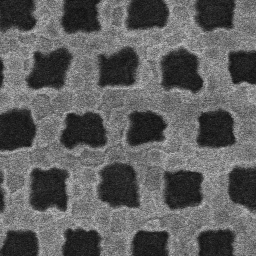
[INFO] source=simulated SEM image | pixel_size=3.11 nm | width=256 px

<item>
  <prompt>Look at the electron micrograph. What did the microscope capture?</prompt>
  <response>a regular array of holes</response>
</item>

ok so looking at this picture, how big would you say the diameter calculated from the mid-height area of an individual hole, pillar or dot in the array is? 121 nm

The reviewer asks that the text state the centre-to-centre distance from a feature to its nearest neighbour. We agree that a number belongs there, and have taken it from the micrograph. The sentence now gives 197 nm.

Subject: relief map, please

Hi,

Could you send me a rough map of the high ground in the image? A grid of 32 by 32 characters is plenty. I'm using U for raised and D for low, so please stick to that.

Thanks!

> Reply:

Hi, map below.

DDDDUUUUDDDDUUUUDDDDDUUUUDDDDUUU
DDDDUUUUDDDDUUUUDDDDDUUUUDDDDUUU
DDDDUUUUDDDDUUUUDDDDDUUUUDDDDUUU
DUDDUUUUDDDDUUUUDDUUUUUUUDDUUUUU
UUUUUUUUUUUUUUUUUUUUUUUUUUUUUUUU
UUUUUUUUUUUUUUUUUUUUUUUUUUUUUUUU
UUUUUUUDUUUUUUUDDUUUUUDUUUUUUDUU
UUUUDDDDDUUUDDDDDUUUDDDDDUUUUDDD
UUUUDDDDUUUUDDDDDUUUDDDDDUUUUDDD
UUUUDDDDUUUUDDDDDUUUDDDDDUUUUDDD
UUUDDDDDUUUUUDDDUUUUDDDDDUUUUUUU
UUUUUUUUUUUUUUUUUUUUUUUUUUUUUUUU
UUUUUUUUUUUUUUUUUUUUUUUUUUUUUUUU
UUUUUUUUUUUUUUUUUUUUUUUUUUUUUUUU
DDDDUUUUDDDDUUUUDDDDUUUUUDDDDUUU
DDDDUUUUDDDDDUUUUDDDDUUUUDDDDUUU
DDDDUUUUDDDDDUUUDDDDUUUUUDDDDUUU
DDDDUUUUDDDDDUUUDDDDUUUUUDDDDUUU
DDUUUUUUUUUUUUUUUUUUUUUUUUUUUUUU
UUUUUUUUUUUUUUUUUUUUUUUUUUUUUUUU
UUUUUUUUUUUUUUUUUUUUUUUUUUUUUUUU
UUUUDDDDUUUUUDDDDUUUUUDDUUUUUDDD
UUUUDDDDUUUUUDDDDUUUUDDDDUUUUDDD
UUUUDDDDUUUUDDDDDUUUUDDDDUUUUDDD
UUUUDDDDUUUUUDDDDUUUUDDDDUUUUDDD
UUUUDDDDUUUUUUDDDUUUUDDDUUUUUUDD
UUUUUUUUUUUUUUUUUUUUUUUUUUUUUUUU
UUUUUUUUUUUUUUUUUUUUUUUUUUUUUUUU
UUUUUUUUUUUUUUUUUUUUUUUUUUUUUUUU
UDDDUUUUDDDDUUUUUDDDDUUUUDDDDUUU
UDDDDUUUDDDDUUUUUDDDDUUUUDDDDUUU
DDDDDUUUDDDDDUUUUDDDDUUUUDDDDUUU